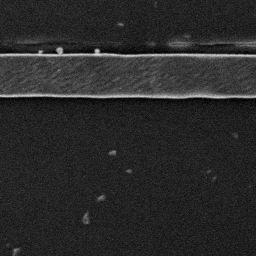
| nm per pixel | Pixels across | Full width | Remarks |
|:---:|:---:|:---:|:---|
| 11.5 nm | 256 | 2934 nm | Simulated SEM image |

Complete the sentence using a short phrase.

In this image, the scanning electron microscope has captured wiring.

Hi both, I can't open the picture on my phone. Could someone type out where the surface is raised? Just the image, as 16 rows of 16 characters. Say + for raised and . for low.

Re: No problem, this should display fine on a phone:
................
................
................
++++++++++++++++
++++++++++++++++
++++++++++++++++
................
................
................
................
................
................
................
................
................
................